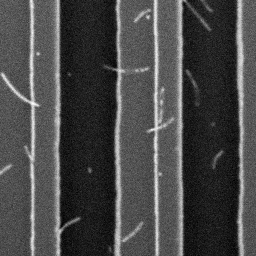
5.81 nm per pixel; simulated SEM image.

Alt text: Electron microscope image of lines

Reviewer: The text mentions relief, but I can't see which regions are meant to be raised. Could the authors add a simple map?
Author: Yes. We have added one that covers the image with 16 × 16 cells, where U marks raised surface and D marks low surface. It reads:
UUUUDDDUUUUDDDDU
UUUUDDDUUUUDDDDU
UUUUDDDUUUUDDDDU
UUUUDDDUUUUDDDDU
UUUUDDDUUUUDDDDU
UUUUDDDUUUUDDDDU
UUUUDDDUUUUDDDDU
UUUUDDDUUUUDDDDU
UUUUDDDUUUUDDDDU
UUUUDDDUUUUDDDDU
UUUUDDDUUUUDDDDU
UUUUDDDUUUUDDDDU
UUUUDDDUUUUDDDDU
UUUUDDDUUUUDDDDU
UUUUDDDUUUUDDDDU
UUUUDDDUUUUDDDDU